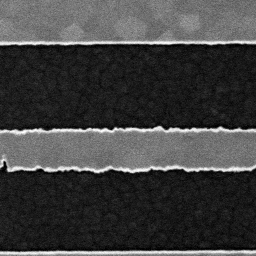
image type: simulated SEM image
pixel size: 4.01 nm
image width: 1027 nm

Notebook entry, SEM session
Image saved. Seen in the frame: one or a few lines or trenches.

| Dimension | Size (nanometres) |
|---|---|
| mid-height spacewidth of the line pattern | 342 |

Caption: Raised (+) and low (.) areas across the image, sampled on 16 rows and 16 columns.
++++++++++++++++
++++++++++++++++
++++++++++++++++
................
................
................
................
................
++++++++++++++++
++++++++++++++++
.+++++++++++++++
................
................
................
................
................